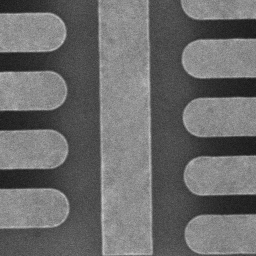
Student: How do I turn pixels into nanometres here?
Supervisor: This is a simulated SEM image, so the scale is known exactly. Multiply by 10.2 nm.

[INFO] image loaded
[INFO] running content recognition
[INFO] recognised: groups of lines, slits or small figures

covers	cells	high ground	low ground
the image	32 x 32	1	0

00000000000011111100000111111111
00000000000011111100000111111111
11111111000011111100000000000000
11111111000011111110000000000000
11111111000011111110000000000000
11111111000011111110000011111111
00000000000001111110000111111111
00000000000001111110000111111111
00000000000001111110000111111111
11111111000001111110000011111111
11111111000001111110000000000000
11111111000001111110000000000000
11111111000001111110000011111111
11111110000001111110000111111111
00000000000001111110000111111111
00000000000001111110000111111111
11111110000001111110000011111111
11111111000001111110000000000000
11111111000001111110000000000000
11111111000001111110000000000000
11111111000001111110000011111111
00000000000001111110000111111111
00000000000001111110000111111111
00000000000001111110000011111111
11111111000001111110000000000000
11111111100001111110000000000000
11111111100001111110000000000000
11111111000001111110000011111111
00000000000001111110000111111111
00000000000001111110000111111111
00000000000001111110000111111111
00000000000001111110000001111111